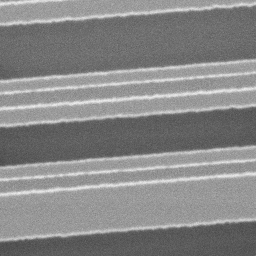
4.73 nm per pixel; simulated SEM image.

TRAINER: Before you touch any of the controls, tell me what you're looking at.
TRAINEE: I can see lines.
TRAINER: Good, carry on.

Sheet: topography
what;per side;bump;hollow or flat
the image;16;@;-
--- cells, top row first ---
@@@@@@@@@@@@@---
@---------------
----------------
----------------
-------@@@@@@@@@
@@@@@@@@@@@@@@@@
@@@@@@@@@@@@@@@@
@@@@@-----------
----------------
------------@@@@
@@@@@@@@@@@@@@@@
@@@@@@@@@@@@@@@@
@@@@@@@@@@@@@@@@
@@@@@@@@@@@@@@@@
@@@@@@----------
----------------